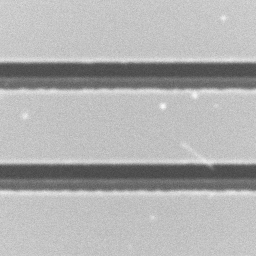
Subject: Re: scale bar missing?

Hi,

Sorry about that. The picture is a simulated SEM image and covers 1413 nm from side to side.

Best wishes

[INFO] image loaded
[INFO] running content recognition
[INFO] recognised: lines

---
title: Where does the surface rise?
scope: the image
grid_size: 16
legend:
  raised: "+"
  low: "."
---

++++++++++++++++
++++++++++++++++
++++++++++++++++
++++++++++++++++
................
................
++++++++++++++++
++++++++++++++++
++++++++++++++++
++++++++++++++++
................
................
++++++++++++++++
++++++++++++++++
++++++++++++++++
++++++++++++++++